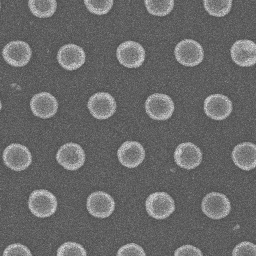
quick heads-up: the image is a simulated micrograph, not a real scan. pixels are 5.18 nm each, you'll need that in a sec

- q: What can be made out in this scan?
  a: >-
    a regular array of raised bodies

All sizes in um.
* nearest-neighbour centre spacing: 0.289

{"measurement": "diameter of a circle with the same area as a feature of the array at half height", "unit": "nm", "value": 131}